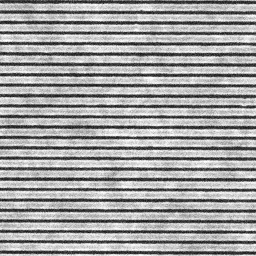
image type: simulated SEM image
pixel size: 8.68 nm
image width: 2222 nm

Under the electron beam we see parallel lines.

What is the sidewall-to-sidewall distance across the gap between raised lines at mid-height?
34.7 nm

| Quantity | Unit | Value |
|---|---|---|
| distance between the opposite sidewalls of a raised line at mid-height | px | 6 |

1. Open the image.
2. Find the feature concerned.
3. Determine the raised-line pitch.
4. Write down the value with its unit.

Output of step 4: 0.0906 um